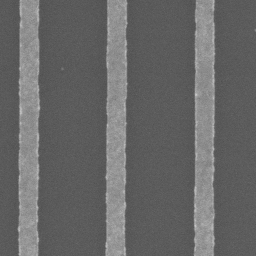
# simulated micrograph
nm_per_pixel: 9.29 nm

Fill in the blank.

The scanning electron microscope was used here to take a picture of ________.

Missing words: lines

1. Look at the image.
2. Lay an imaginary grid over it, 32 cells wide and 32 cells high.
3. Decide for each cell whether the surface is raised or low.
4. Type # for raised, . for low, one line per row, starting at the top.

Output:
...##.........##.........##.....
...##.........##........###.....
...##.........##........###.....
...##.........##.........##.....
...##.........##........###.....
...##........###........###.....
...##........###........###.....
...##........###........###.....
..###........###........###.....
...##.........##........###.....
..###.........##........###.....
..###.........##........###.....
...##........###........###.....
...##........###........###.....
...##........###........###.....
...##........###........###.....
..###........###........###.....
..###........###........###.....
..###........###........###.....
..###........###........###.....
..###........###........###.....
..###........###........###.....
..###........###........###.....
..###........###........###.....
..###........###........###.....
..###........###........###.....
...##........###........###.....
..###........###........###.....
..###........###........###.....
..###........###........###.....
..###........###........###.....
..###........###........###.....